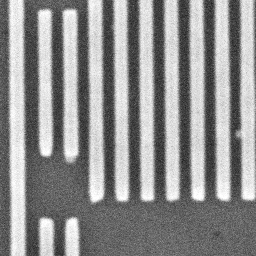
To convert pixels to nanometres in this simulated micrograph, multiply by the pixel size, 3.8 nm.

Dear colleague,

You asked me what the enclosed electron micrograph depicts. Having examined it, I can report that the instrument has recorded wiring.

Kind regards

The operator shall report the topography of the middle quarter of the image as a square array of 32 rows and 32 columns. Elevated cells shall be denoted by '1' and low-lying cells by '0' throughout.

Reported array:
11100001100001110001110001110000
11100001100001110001110001110000
11100001100001110001110001110000
11100001100001110001110001110000
11100001100001110001110001110000
11100001100001110001110001110000
11100001100001110001110001110000
11100001100001110001110001110000
11100001100001110001110001110000
11100001100001110001110001110000
11100001100001110001110000110000
11100001100001110001110000110000
11100001100001110001110000110000
11100001100001110001110000110000
11100001100001110001110000110000
11100001100001110001110000110000
11100001100001110001110000110000
11100001100001110001110000110000
11100001100001110001110000110000
11100001110001110001110000110000
11100001110001110001110000110000
11100001110001110001110000110000
11100001110001110001110000110000
01000001110001110001110000110000
00000001110001110001110000110000
00000001110001110001110000110000
00000001110001110001110000110000
00000001110001110001110000110000
00000001110001110001110000110000
00000001110001110001110000110000
00000001110001110001110000110000
00000001110001110001110000110000